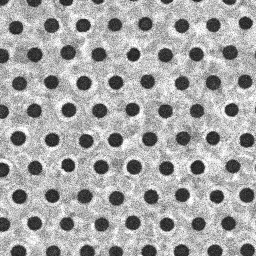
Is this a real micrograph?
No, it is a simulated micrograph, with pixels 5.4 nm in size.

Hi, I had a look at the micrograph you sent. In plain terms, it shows a regular array of holes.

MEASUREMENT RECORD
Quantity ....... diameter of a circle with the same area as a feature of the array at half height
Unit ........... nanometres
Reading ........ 78.8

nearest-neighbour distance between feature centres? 0.168 um